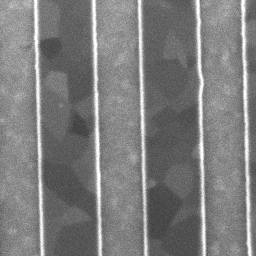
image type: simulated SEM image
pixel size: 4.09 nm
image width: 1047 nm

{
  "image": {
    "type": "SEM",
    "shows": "one or a few lines or trenches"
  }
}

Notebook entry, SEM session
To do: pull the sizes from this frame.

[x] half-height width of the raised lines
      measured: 242 nm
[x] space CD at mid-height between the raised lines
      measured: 181 nanometres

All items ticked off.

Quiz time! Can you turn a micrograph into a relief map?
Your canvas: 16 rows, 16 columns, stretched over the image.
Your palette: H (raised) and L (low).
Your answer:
LLHHHHLLLHHHLLLH
LLHHHHLLLHHHLLLH
LLHHHHLLLHHHLLLH
LLHHHHLLLHHHLLLH
LLHHHHLLLHHHHLLH
LLHHHHLLLHHHHLLH
LLHHHHLLLHHHHLLH
LLHHHHLLLHHHHLLH
LLHHHHLLLHHHHLLH
LLHHHHLLLHHHHLLH
LLHHHHLLLHHHHLLH
LLHHHHLLLHHHHLLH
LLLHHHLLLHHHHLLH
LLLHHHLLLHHHHLLL
LLLHHHLLLHHHHLLL
LLLHHHLLLHHHHLLL